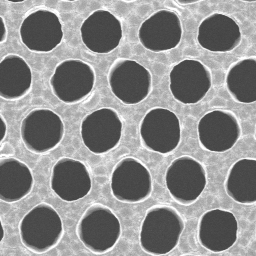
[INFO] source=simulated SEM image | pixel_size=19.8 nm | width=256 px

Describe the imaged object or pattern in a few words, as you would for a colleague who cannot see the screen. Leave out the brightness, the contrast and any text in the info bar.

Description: a regular array of holes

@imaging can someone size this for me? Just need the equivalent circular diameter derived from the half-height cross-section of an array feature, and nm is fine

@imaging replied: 824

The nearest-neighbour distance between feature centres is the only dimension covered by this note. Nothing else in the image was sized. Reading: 1120 nanometers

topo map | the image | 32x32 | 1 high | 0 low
11111111111111111111111111111111
11110011111101111111001111111111
11100001111000011100001111000111
01100000110000011000000110000011
11100000110000011000000110000011
11100001111000011100001110000011
11111111111100111111111111111111
00011111111111111111111011111100
00001110000111000011110000111000
00001110000011000001100000110000
00001100000011000001100000110000
00011110000111000001100000111000
11111111001111100011110001111100
11111111111111111111111111111111
11100001111000011100001111000111
01100000110000011100001110000011
01100000110000011100000110000011
11100000110000011100001110000011
11110011111000111110001111000111
11111111111111111111111111111111
00011110001111100011100001111000
00001110000111000001100001111000
00001110000111000001100000110000
00001110000111000001100001110000
00011110001111000011110001111000
11111111111111111111111111111111
11110001111000111110001111001111
11100000110000011100000110000111
11100000110000011100000110000011
11100001110000011100000110000011
11100001111000111100001110000111
11111111111111111110011111111111